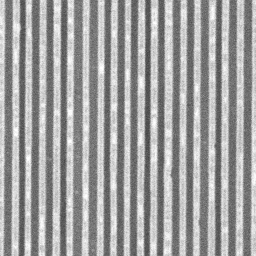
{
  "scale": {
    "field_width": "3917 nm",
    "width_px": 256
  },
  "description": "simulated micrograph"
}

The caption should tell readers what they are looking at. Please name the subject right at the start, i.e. parallel lines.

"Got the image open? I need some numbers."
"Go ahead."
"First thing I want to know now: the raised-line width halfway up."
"88 nm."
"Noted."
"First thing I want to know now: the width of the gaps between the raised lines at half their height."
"132 nm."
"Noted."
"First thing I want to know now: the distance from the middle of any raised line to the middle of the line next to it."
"214 nm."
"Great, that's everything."